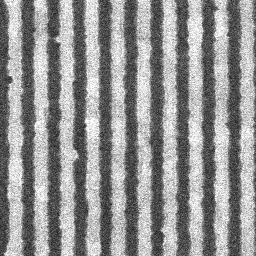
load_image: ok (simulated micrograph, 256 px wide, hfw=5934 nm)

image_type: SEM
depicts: parallel lines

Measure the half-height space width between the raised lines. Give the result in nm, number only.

296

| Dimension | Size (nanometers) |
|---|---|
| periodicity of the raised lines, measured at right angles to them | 598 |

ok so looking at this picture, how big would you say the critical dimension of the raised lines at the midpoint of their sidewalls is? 298 nanometers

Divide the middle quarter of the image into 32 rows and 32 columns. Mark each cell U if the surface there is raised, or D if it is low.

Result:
UUDDDDUUUDDDUUUDDDUUUUDDDUUUDDDU
UUDDDDUUUDDDUUUDDDUUUUDDDUUUDDDU
UUDDDDUUUDDDUUUDDDUUUUDDDUUUDDDU
UUUDDDUUUDDDUUUDDDUUUUDDDUUUDDDU
UUDDDDUUUDDDUUUDDDUUUUDDDUUUDDDU
UUDDDDUUUDDDUUUDDDUUUUDDDUUUDDDU
UUDDDDUUUDDDUUUDDDUUUUDDDUUUDDDU
UUDDDDUUUDDDUUUDDDUUUUDDDUUUDDDU
UUDDDUUUUDDDUUUDDDUUUUDDDUUUDDDU
UUDDDDUUUDDDUUUDDDUUUUDDDUUUDDDU
UUUDDDUUUDDDUUUDDDUUUUDDDUUUDDDU
UUUDDDUUUDDDUUUDDDUUUDDDDUUUDDDU
UUDDDDUUUDDDUUUDDDUUUUDDDUUUDDDU
UUDDDUUUUDDDUUUDDDUUUUDDDUUUDDDU
UUDDDUUUUDDDUUUDDDUUUUDDDUUUDDDU
UUDDDDUUUDDDUUUDDDDUUDDDDUUUDDDU
UUDDDUUUUDDDUUUDDDUUUDDDDUUUDDDU
UUDDDDUUUDDDUUUDDDUUUUDDDUUUDDDU
UUDDDDUUUDDDUUUDDDUUUDDDDUUUDDDU
UUDDDDUUUDDDUUUDDDUUUDDDDUUUDDDU
UUDDDDUUUDDDUUUDDDDUUDDDDUUUDDDU
UUUDDDUUUDDDUUUDDDUUUUDDDUUUDDDD
UUUDDDUUUDDDUUUDDDUUUUDDDUUUDDDU
UUUDDDUUUDDDUUUDDDUUUUDDDUUUDDDU
UUDDDDUUUDDDUUUDDDUUUDDDDUUUDDDU
UUDDDDUUUDDDUUUDDDUUUUDDDUUUDDDD
UUDDDDUUUDDDUUUDDDUUUUDDDUUUDDDD
UUDDDUUUUDDDUUUUDDUUUUDDDUUUDDDU
UUDDDUUUUDDDUUUDDDUUUUDDDUUUDDDU
UUDDDUUUUDDDUUUDDDDUUUDDDUUUDDDU
UUUDDUUUUDDDUUUDDDUUUUDDDUUUDDDU
UUUDDDUUUDDDUUUDDDUUUUDDDUUUDDDU